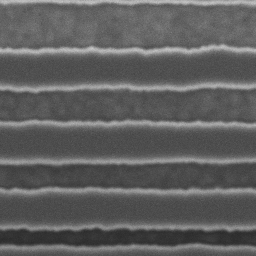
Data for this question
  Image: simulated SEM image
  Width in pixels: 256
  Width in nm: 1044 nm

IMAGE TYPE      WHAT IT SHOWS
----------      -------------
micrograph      lines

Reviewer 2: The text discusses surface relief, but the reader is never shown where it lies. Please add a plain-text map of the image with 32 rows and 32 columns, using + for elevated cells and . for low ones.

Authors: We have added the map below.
........................+++....+
................................
................................
................................
................................
................................
++++++++++++++++++++++++++++++++
++++++++++++++++++++++++++++++++
++++++++++++++++++++++++++++++++
++++++++++++++++++++++++++++++++
++++++++++++++++++++++++++++++++
................................
................................
................................
................................
++++++++++++++++++++++++++++++++
++++++++++++++++++++++++++++++++
++++++++++++++++++++++++++++++++
++++++++++++++++++++++++++++++++
++++++++++++++++++++++++++++++++
+++...++........+...............
................................
................................
......++...+....................
++++++++++++++++++++++++++++++++
++++++++++++++++++++++++++++++++
++++++++++++++++++++++++++++++++
++++++++++++++++++++++++++++++++
+++++++++++++++.++++++++++++++++
................................
.......................+++......
++++++++++++++++++++++++++++++++